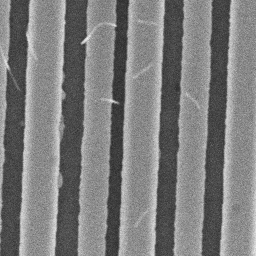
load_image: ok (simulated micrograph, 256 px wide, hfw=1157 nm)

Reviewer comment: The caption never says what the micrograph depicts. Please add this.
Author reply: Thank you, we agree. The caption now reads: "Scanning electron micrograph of lines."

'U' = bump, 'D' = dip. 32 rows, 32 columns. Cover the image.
UDDDUUUUDDDUUUDDUUUUUDDUUUUDDUUU
UDDDUUUUDDDUUUDDUUUUDDDUUUDDDUUU
UDDDUUUUDDDUUUDDUUUUDDDUUUDDDUUU
UDDDUUUUDDDUUUDDUUUUDDDUUUDDDUUU
UDDDUUUUDDDUUUDDUUUUDDDUUUDDDUUU
UDDUUUUUDDDUUUDDUUUUDDDUUUDDDUUU
UDDDUUUUDDDUUUDDUUUUDDDUUUDDDUUU
UDDDUUUUDDDUUUDDUUUUDDDUUUDDDUUU
UDDUUUUUDDDUUUDDUUUUDDDUUUDDDUUU
UDDUUUUUDDDUUUDDUUUUDDDUUUDDDUUU
UDDUUUUUDDDUUUDDUUUUDDDUUUDDUUUU
UDDUUUUUDDDUUUDDUUUUDDDUUUDDUUUU
UDDUUUUUDDDUUUDDUUUUDDDUUUDDUUUU
UDDUUUUUDDDUUUDDUUUUDDDUUUDDUUUU
UDDUUUUUDDDUUUDDUUUUDDUUUUDDUUUU
UDDUUUUUDDDUUUDDUUUUDDUUUUDDUUUU
UDDUUUUDDDDUUUDDUUUUDDUUUUDDUUUU
DDDUUUUDDDUUUUDUUUUUDDUUUUDDUUUU
UDDUUUUDDDUUUUDUUUUUDDUUUUDDUUUU
UDDUUUUDDDUUUUDUUUUUDDUUUUDDUUUU
DDDUUUUDDDUUUUDUUUUUDDUUUUDDUUUU
DDDUUUUDDDUUUUDUUUUUDDUUUUDDUUUU
DDDUUUUUDDUUUUDUUUUUDDUUUUDDUUUU
DDDUUUUDDDUUUUDUUUUUDDUUUUDDUUUU
DDDUUUUDDDUUUUDUUUUDDDUUUDDDUUUU
DDDUUUUDDDUUUDDUUUUUDDUUUDDDUUUU
DDDUUUUDDDUUUDDUUUUDDDUUUDDDUUUU
DDDUUUUDDDUUUDDUUUUDDDUUUDDDUUUU
DDDUUUUDDDUUUDDUUUUDDDUUUDDDUUUU
DDDUUUUDDDUUUDDUUUUDDDUUUDDDUUUU
DDDUUUUDDDUUUDDUUUUDDDUUUDDDUUUU
DDDUUUUDDDUUUDDUUUUDDDUUUDDDUUUU